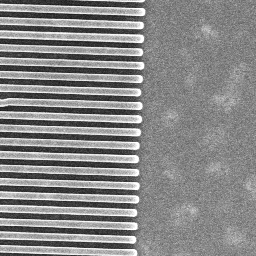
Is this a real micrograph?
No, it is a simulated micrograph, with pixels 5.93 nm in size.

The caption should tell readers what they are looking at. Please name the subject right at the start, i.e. parallel lines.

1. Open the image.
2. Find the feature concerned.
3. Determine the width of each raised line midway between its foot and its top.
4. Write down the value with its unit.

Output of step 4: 44.5 nanometers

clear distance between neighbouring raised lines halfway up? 35.6 nm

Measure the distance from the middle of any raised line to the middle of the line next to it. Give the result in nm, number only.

79.5